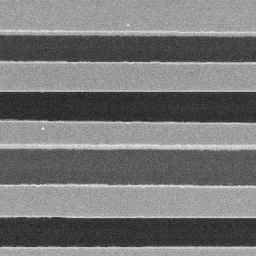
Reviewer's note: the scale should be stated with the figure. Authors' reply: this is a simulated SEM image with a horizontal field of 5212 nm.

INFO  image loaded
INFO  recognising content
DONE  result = lines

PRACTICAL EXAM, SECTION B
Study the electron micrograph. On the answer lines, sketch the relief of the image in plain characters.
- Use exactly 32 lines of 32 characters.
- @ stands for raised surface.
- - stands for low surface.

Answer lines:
@@@@@@@@@@@@@@@@@@@@@@@@@@@@@@@@
@@@@@@@@@@@@@@@@@@@@@@@@@@@@@@@@
@@@@@@@@@@@@@@@@@@@@@@@@@@@@@@@@
@@@@@@@@@@@@@@@@@@@@@@@@@@@@@@@@
--------------------------------
--------------------------------
--------------------------------
--------------------------------
@@@@@@@@@@@@@@@@@@@@@@@@@@@@@@@@
@@@@@@@@@@@@@@@@@@@@@@@@@@@@@@@@
@@@@@@@@@@@@@@@@@@@@@@@@@@@@@@@@
--------------------------------
--------------------------------
--------------------------------
--------------------------------
@@@@@@@@@@@@@@@@@@@@@@@@@@@@@@@-
@@@@@@@@@@@@@@@@@@@@@@@@@@@@@@@@
@@@@@@@@@@@@@@@@@@@@@@@@@@@@@@@@
--------------------------------
--------------------------------
--------------------------------
--------------------------------
--------------------------------
@@@@@@@@@@@@@@@@@@@@@@@@@@@@@@@@
@@@@@@@@@@@@@@@@@@@@@@@@@@@@@@@@
@@@@@@@@@@@@@@@@@@@@@@@@@@@@@@@@
@@@@@@@@@@@@@@@@@@@@@@@@@@@@@@@@
--------------------------------
--------------------------------
--------------------------------
--------------------------------
@@@@@@@@@@@@@@@@@@@@@@@@@@@@@@@@